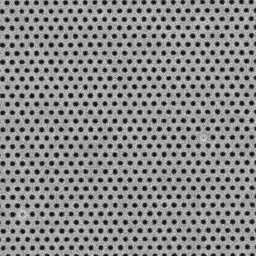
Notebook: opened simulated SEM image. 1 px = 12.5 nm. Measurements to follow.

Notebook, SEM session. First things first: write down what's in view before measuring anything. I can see a regular array of holes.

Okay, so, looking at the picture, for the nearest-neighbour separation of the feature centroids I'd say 117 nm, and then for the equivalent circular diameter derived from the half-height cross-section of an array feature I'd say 66.3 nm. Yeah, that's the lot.